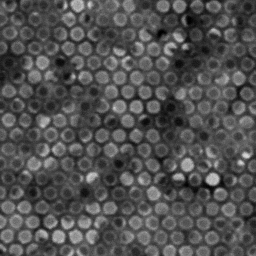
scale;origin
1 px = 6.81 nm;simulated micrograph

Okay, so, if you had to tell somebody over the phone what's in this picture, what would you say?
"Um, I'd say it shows a regular array of raised bodies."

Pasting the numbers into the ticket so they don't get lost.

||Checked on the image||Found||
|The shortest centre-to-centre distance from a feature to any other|112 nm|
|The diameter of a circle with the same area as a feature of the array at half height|0.0795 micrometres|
